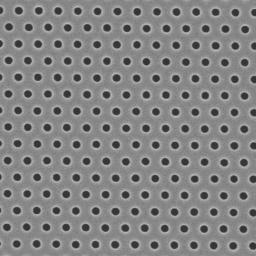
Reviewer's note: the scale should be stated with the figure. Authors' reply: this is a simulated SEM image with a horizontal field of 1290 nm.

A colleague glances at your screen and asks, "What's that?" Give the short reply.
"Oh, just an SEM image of a regular array of holes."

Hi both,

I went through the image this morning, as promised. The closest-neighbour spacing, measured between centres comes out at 95.9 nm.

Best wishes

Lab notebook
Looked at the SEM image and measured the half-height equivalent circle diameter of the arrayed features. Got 39.4 nanometres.